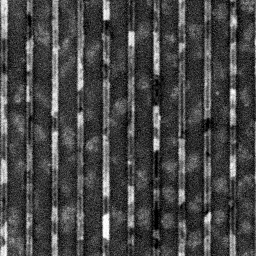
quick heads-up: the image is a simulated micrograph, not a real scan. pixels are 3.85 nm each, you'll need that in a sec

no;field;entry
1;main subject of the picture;parallel lines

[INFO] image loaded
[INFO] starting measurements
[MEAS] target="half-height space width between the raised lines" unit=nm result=77.4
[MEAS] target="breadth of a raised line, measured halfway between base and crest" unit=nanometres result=18.3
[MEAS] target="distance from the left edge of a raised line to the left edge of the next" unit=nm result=97.9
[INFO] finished